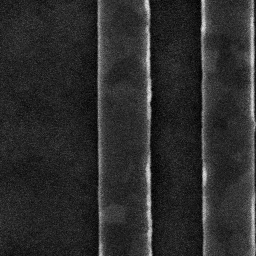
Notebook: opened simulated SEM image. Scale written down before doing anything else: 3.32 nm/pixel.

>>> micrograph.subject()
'one or a few lines or trenches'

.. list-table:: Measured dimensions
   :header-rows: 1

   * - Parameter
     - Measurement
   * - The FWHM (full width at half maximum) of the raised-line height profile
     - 172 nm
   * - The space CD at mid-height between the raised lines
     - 52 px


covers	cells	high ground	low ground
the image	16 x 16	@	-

------@@@----@@@
------@@@----@@@
------@@@----@@@
------@@@----@@@
------@@@----@@@
------@@@----@@@
------@@@----@@@
------@@@----@@@
------@@@----@@@
------@@@----@@@
------@@@----@@@
------@@@----@@@
------@@@----@@@
------@@@----@@@
------@@@----@@@
------@@@----@@@